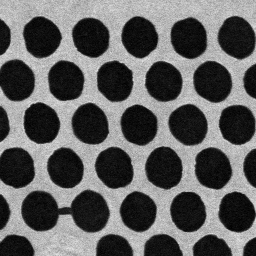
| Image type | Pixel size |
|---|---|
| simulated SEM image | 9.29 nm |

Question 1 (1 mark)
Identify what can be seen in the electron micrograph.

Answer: a regular array of holes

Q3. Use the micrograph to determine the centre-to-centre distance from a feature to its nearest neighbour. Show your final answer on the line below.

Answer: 453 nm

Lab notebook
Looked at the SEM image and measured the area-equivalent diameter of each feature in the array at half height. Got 0.356 micrometres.